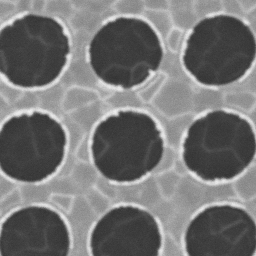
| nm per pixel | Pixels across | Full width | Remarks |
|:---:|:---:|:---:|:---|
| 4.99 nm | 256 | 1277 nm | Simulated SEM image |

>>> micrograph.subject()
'holes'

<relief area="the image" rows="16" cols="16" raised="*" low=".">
****************
*...***..***...*
....**....**....
....**....**....
....**...***...*
****************
****************
*..****..***...*
....**....**....
....**....*.....
....**....**...*
****************
****************
*...***..***....
....**....**....
....**....**....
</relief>